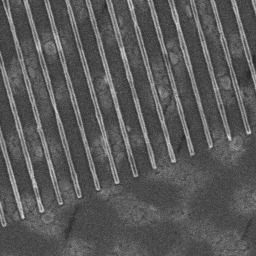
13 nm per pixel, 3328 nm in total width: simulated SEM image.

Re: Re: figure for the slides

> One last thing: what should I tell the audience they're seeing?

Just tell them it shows parallel lines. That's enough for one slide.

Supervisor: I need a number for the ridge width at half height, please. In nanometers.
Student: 36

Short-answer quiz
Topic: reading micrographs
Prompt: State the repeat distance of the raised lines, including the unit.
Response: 0.26 µm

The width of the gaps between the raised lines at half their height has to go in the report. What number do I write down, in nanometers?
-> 221